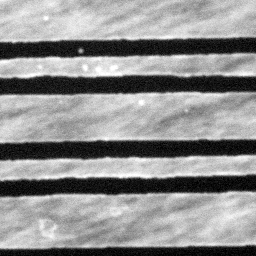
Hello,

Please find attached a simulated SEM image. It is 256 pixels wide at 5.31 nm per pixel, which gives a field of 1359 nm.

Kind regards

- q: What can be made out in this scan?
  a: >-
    lines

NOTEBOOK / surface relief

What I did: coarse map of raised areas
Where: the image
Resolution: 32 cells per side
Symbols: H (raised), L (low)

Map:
HHHHHHHHHHHHHHHHHHHHHHHHHHHHHHHH
HHHHHHHHHHHHHHHHHHHHHHHHHHHHHHHH
HHHHHHHHHHHHHHHHHHHHHHHHHHHHHHHH
HHHHHHHHHHHHHHHHHHHHHHHHHHHHHHHH
HHHHHHHHHHHHHHHHHHHHHHHHHHHHHHHH
LLLLLLLLLLLLLLLLLLLLLLLLLLLLLLLL
LLLLLLLLLLLLLLLLLLLLLLLLLLLLLLLL
LHHHHHHHHHHHHHHHHHHHHHHHHHHHHHHH
HHHHHHHHHHHHHHHHHHHHHHHHHHHHHHHH
HHHHLLLLLLLLLLLLLLLLLLLHLLLLLLLL
LLLLLLLLLLLLLLLLLLLLLLLLLLLLLLLL
LLLLLLLLLLLLLLLLLLLLLLLLLLLLLLLL
HHHHHHHHHHHHHHHHHHHHHHHHHHHHHHHH
HHHHHHHHHHHHHHHHHHHHHHHHHHHHHHHH
HHHHHHHHHHHHHHHHHHHHHHHHHHHHHHHH
HHHHHHHHHHHHHHHHHHHHHHHHHHHHHHHH
HHHHHHHHHHHHHHHHHHHHHHHHHHHHHHHH
HHHHHHHHHHHHLHLLLLLLLLLLLLLLLLLL
LLLLLLLLLLLLLLLLLLLLLLLLLLLLLLLL
LLLLLLLLLLLLLLLLLLLLLLLLLLLLLLLL
HHHHHHHHHHHHHHHHHHHHHHHHHHHHHHHH
HHHHHHHHHHHHHHHHHHHHHHHHHHHHHHHH
LLLLLLLLLLLLLLLLLLLLLLLLLLLLLLLL
LLLLLLLLLLLLLLLLLLLLLLLLLLLLLLLL
LLLLLHHHHHHHHHHHHHHHHHHHHHHHHHHH
HHHHHHHHHHHHHHHHHHHHHHHHHHHHHHHH
HHHHHHHHHHHHHHHHHHHHHHHHHHHHHHHH
HHHHHHHHHHHHHHHHHHHHHHHHHHHHHHHH
HHHHHHHHHHHHHHHHHHHHHHHHHHHHHHHH
HHHHHHHHHHHHHHHHHHHHHHHHHHHHHHHH
HHHHHHHHHHHHHHHHHHHHHHHHHHHHHHHH
LLLLLLLLLLLLLLLLLLLLLLLLLLLLLLLL